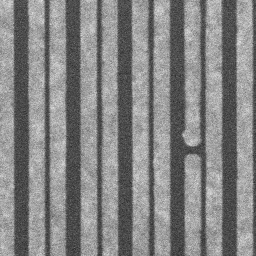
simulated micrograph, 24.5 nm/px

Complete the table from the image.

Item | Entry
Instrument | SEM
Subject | parallel lines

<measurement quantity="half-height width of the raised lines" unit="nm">358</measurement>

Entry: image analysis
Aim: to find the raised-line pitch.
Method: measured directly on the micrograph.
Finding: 637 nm